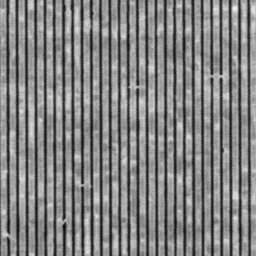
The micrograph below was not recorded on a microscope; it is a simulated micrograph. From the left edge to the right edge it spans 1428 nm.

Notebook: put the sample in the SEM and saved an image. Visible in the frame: parallel lines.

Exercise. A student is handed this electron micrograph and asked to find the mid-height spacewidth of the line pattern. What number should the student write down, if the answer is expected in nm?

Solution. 19.5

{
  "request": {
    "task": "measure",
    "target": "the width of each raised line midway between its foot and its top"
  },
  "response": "5.13 pixels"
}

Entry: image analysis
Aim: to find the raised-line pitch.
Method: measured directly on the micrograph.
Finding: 9.27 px